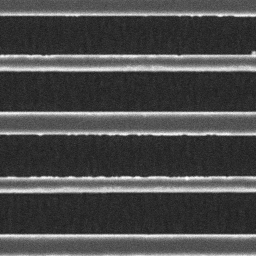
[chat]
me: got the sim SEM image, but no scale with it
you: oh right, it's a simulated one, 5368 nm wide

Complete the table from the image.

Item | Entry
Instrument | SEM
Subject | lines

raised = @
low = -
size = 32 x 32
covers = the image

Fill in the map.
@@@@@@@@@@@@@@@@@@@@@@@@@@@@@@@@
@@@@@@@@@@@@@@@@@@@@@@@@@@@@@@@@
--------------------------------
--------------------------------
--------------------------------
--------------------------------
--------------------------------
@@@@@@@@@@@@@@@@@@@@@@@@@@@@@@@@
@@@@@@@@@@@@@@@@@@@@@@@@@@@@@@@@
--------------------------------
--------------------------------
--------------------------------
--------------------------------
--------------------------------
@@@@@@@@@@@@@@@@@@@@@@@@@@@@@@@@
@@@@@@@@@@@@@@@@@@@@@@@@@@@@@@@@
@@@@@@@@@@@@@@@@@@@@@@@@@@@@@@@@
--------------------------------
--------------------------------
--------------------------------
--------------------------------
--------------------------------
@@@@@@@@@@@@@@@@@@@@@@@@@@@@@@@@
@@@@@@@@@@@@@@@@@@@@@@@@@@@@@@@@
--------------------------------
--------------------------------
--------------------------------
--------------------------------
--------------------------------
@@@@@-@@@@@@@@@@@@-@@@@@@@@@@@@@
@@@@@@@@@@@@@@@@@@@@@@@@@@@@@@@@
@@@@@@@@@@@@@@@@@@@@@@@@@@@@@@@@